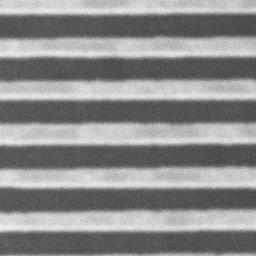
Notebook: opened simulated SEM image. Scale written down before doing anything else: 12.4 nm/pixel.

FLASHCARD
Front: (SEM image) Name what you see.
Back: lines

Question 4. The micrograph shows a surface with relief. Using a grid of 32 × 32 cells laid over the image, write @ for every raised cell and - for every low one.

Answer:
@@@@@@@@@@@@@@@@@@@@@@@@@@@@@@@@
@@@@@@@@@@@@@@@-@@@--------@@---
--------------------------------
--------------------------------
--------------------------------
@@@@@@@@@@@@@@@@@@@@@@@@@@@@@@@@
@@@@@@@@@@@@@@@@@@@@@@@@@@@@@@@@
--------------------------------
--------------------------------
--------------------------------
@@@@@@@@@@@@@@@@@@@@@@@@@@@@@@@@
@@@@@@@@@@@@@@@@@@@@@@@@@@@@@@@@
--------------------------------
--------------------------------
--------------------------------
--------------------------------
@@@@@@@@@@@@@@@@@@@@@@@@@@@@@@@@
@@@@@@@@@@@@@@@@@@@@@@@@@@@@@@@@
--------------------------------
--------------------------------
--------------------------------
@@@@@@@@@@@@@@@@@@@@@@@@@@@@@@@@
@@@@@@@@@@@@@@@@@@@@@@@@@@@@@@@@
--------------------------------
--------------------------------
--------------------------------
---------------@@@@-@@@@@@@@@@@@
@@@@@@@@@@@@@@@@@@@@@@@@@@@@@@@@
@@@@@@@@@@@@@@@@@@@@@@@@@@@@@@@@
--------------------------------
--------------------------------
--------------------------------